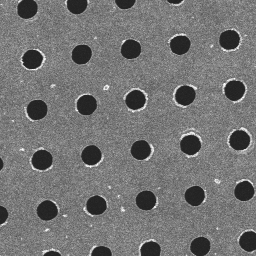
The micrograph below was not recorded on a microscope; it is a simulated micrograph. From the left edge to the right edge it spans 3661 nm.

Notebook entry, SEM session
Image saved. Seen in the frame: a regular array of holes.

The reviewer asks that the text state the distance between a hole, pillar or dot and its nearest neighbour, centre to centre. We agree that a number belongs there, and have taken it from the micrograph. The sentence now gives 707 nanometers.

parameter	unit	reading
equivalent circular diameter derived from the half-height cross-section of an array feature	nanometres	291